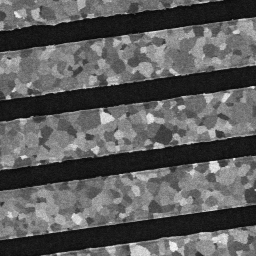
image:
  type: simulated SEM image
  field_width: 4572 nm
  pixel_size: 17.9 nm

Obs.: one or a few lines or trenches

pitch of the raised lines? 1230 nm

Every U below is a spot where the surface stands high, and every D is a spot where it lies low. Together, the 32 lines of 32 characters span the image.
UUUUUUUUUUUUUUUUUUUUUUUUDDDDDDDD
UUUUUUUUUUUUUUUUUUDDDDDDDDDDDDDD
UUUUUUUUUUDDDDDDDDDDDDDDDDDDDUUU
UUUDDDDDDDDDDDDDDDDDDDUUUUUUUUUU
DDDDDDDDDDDDDDDUUUUUUUUUUUUUUUUU
DDDDDDDDUUUUUUUUUUUUUUUUUUUUUUUU
DUUUUUUUUUUUUUUUUUUUUUUUUUUUUUUU
UUUUUUUUUUUUUUUUUUUUUUUUUUUUUUUU
UUUUUUUUUUUUUUUUUUUUUUUUUUUUUDDD
UUUUUUUUUUUUUUUUUUUUUUDDDDDDDDDD
UUUUUUUUUUUUUUUDDDDDDDDDDDDDDDDD
UUUUUUUDDDDDDDDDDDDDDDDDDDDUUUUU
DDDDDDDDDDDDDDDDDDDDDUUUUUUUUUUU
DDDDDDDDDDDDDUUUUUUUUUUUUUUUUUUU
DDDDDUUUUUUUUUUUUUUUUUUUUUUUUUUU
UUUUUUUUUUUUUUUUUUUUUUUUUUUUUUUU
UUUUUUUUUUUUUUUUUUUUUUUUUUUUUUUU
UUUUUUUUUUUUUUUUUUUUUUUUUUUDDDDD
UUUUUUUUUUUUUUUUUUUUDDDDDDDDDDDD
UUUUUUUUUUUUUDDDDDDDDDDDDDDDDDDD
UUUUUDDDDDDDDDDDDDDDDDDDUUUUUUUU
DDDDDDDDDDDDDDDDDUUUUUUUUUUUUUUU
DDDDDDDDDDUUUUUUUUUUUUUUUUUUUUUU
DDDUUUUUUUUUUUUUUUUUUUUUUUUUUUUU
UUUUUUUUUUUUUUUUUUUUUUUUUUUUUUUU
UUUUUUUUUUUUUUUUUUUUUUUUUUUUUUUU
UUUUUUUUUUUUUUUUUUUUUUUUUDDDDDDD
UUUUUUUUUUUUUUUUUUDDDDDDDDDDDDDD
UUUUUUUUUUDDDDDDDDDDDDDDDDDDDDUU
UUUDDDDDDDDDDDDDDDDDDDDUUUUUUUUU
DDDDDDDDDDDDDDDDUUUUUUUUUUUUUUUU
DDDDDDDDDUUUUUUUUUUUUUUUUUUUUUUU